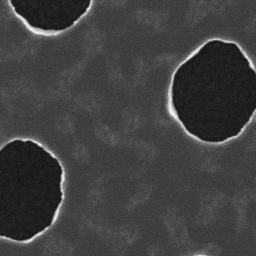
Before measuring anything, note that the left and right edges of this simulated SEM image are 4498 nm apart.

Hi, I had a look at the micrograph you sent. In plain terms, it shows holes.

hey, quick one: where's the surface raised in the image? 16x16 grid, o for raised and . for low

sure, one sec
o....ooooooooooo
oo...ooooooooooo
oooooooooooooooo
oooooooooooo...o
ooooooooooo.....
ooooooooooo.....
ooooooooooo.....
ooooooooooo.....
oooooooooooo...o
...ooooooooooooo
....oooooooooooo
....oooooooooooo
....oooooooooooo
...ooooooooooooo
...ooooooooooooo
oooooooooooooooo